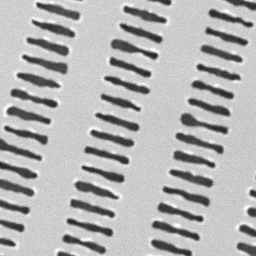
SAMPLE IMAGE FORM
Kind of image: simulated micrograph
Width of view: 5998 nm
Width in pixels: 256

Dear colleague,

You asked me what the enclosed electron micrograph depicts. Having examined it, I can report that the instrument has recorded a regular array of holes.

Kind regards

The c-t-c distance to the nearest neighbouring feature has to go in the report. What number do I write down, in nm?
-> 427